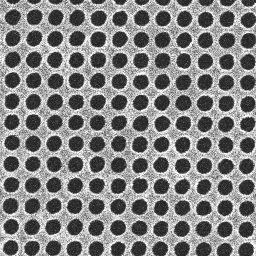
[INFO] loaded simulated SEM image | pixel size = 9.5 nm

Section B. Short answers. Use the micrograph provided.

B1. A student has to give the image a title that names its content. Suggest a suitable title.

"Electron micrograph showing a regular array of holes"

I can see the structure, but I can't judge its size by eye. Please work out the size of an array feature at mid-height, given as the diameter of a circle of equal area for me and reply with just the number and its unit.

153 nm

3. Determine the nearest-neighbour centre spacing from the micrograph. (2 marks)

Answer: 198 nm